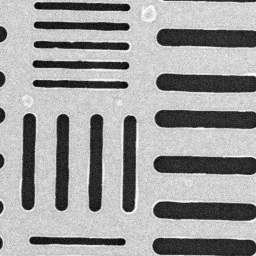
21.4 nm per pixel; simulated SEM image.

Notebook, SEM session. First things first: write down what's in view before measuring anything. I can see groups of lines, slits or small figures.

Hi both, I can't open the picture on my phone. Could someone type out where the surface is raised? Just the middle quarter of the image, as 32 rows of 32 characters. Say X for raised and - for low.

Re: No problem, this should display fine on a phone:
----------------XXXXXXXXXXXXXXXX
XXXXXXXXX------XXXXXXXXXXXXXXXXX
XXXXXXXXXXXXXXXXXXXXXXXX--------
XXXXXXXXXXXXXXXXXXXXXXX---------
---------------XXXXXXXX---------
----------------XXXXXXX---------
XXXXXXXXXXXXXXXXXXXXXXXX--------
XXXXXXXXXXXXXXXXXXXXXXXXXXXXXXXX
XXXXXXXXXXXXXXXXXXXXXXXXXXXXXXXX
XXXXXXXXXXXXXXXXXXXXXXXXXXXXXXXX
XXXXXXXXXXXXXXXXXXXXXXXXXXXXXXXX
XXXXXXXXXXXXXXXXXXXXXXXX--------
XXXXXXXX-XXXXXXXXXXXXXX---------
-XXXXXX---XXXXX---XXXXX---------
--XXXX----XXXXX---XXXXX---------
-XXXXX----XXXXX---XXXXXX--------
-XXXXX----XXXX-----XXXXXXXXXXXXX
-XXXXX----XXXX-----XXXXXXXXXXXXX
-XXXXX----XXXX-----XXXXXXXXXXXXX
-XXXXX----XXXX-----XXXXXXXXXXXXX
-XXXXX----XXXX-----XXXXXXXXXXXXX
-XXXXX----XXXX----XXXXXXXXXXXXXX
-XXXXX----XXXX----XXXXXXXXXXXXXX
-XXXXX----XXXX----XXXXX---------
-XXXXX----XXXX----XXXX----------
-XXXXX----XXXX----XXXX----------
-XXXXX----XXXX----XXXXX---------
-XXXXX----XXXX----XXXXXXXXX-----
-XXXXX----XXXX----XXXXXXXXXXXXXX
-XXXXX----XXXX----XXXXXXXXXXXXXX
-XXXXX----XXXX----XXXXXXXXXXXXXX
-XXXXX----XXXX----XXXXXXXXXXXXXX